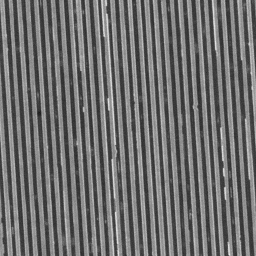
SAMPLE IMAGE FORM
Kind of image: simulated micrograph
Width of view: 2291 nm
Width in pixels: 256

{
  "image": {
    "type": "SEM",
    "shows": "parallel lines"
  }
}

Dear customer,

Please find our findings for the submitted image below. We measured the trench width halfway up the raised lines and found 39.1 nm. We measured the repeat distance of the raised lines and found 8.48 px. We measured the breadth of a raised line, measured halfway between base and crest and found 31.3 nm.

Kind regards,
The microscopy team